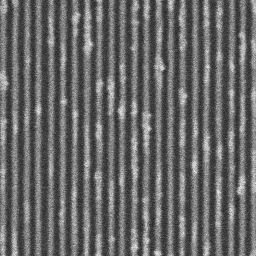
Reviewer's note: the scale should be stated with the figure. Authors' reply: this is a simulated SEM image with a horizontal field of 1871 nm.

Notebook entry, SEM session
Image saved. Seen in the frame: parallel lines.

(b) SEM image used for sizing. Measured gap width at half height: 58.5 nm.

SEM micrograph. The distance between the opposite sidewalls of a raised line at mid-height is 3.99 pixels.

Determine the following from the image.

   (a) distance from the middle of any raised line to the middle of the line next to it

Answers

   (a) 0.0875 microns